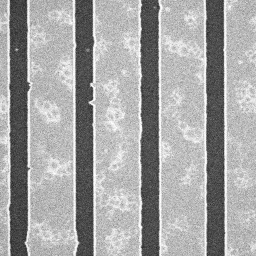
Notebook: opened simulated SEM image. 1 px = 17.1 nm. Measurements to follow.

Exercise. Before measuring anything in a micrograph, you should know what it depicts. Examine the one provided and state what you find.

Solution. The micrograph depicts one or a few lines or trenches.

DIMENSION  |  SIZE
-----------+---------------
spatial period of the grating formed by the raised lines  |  1120 nm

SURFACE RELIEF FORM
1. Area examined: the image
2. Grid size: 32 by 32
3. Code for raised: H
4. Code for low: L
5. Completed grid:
HLLLHHHHHLLLHHHHHHLLHHHHHHLLHHHH
HLLLHHHHHLLLHHHHHLLLHHHHHHLLHHHH
HLLLHHHHHLLLHHHHHLLLHHHHHHLLHHHH
HLLLHHHHHLLLHHHHHLLLHHHHHHLLHHHH
HLLLHHHHHLLLHHHHHLLLHHHHHHLLHHHH
HLLLHHHHHLLLHHHHHLLLHHHHHHLLHHHH
HLLLHHHHHLLLHHHHHLLLHHHHHHLLHHHH
HLLLHHHHHLLLHHHHHLLLHHHHHHLLHHHH
HLLLHHHHHLLLHHHHHLLLHHHHHHLLHHHH
HLLLHHHHHLLLHHHHHLLLHHHHHHLLHHHH
HLLLHHHHHLLLHHHHHLLLHHHHHHLLHHHH
HLLLHHHHHLLLHHHHHLLLHHHHHHLLHHHH
HLLLHHHHHLLLHHHHHLLLHHHHHHLLHHHH
HLLLHHHHHLLLHHHHHLLLHHHHHHLLHHHH
HLLLHHHHHLLLHHHHHLLLHHHHHHLLHHHH
HLLLHHHHHLLLHHHHHHLLHHHHHHLLHHHH
HLLLHHHHHLLLHHHHHHLLHHHHHHLLHHHH
HLLLHHHHHLLLHHHHHHLLHHHHHHLLHHHH
HLLLHHHHHLLLHHHHHLLLHHHHHHLLHHHH
HLLLHHHHHLLLHHHHHLLLHHHHHHLLHHHH
HLLLHHHHHLLLHHHHHLLLHHHHHHLLHHHH
HLLLHHHHHLLLHHHHHLLLHHHHHHLLHHHH
HLLLHHHHHLLLHHHHHHLLHHHHHHLLHHHH
HLLLHHHHHLLLHHHHHLLLHHHHHHLLHHHH
HLLLHHHHHLLLHHHHHHLLHHHHHHLLHHHH
HLLLHHHHHLLLHHHHHHLLHHHHHHLLHHHH
HLLLHHHHHLLLHHHHHHLLHHHHHHLLHHHH
HLLLHHHHHLLLHHHHHHLLHHHHHHLLHHHH
HLLLHHHHHLLLHHHHHHLLHHHHHHLLHHHH
HLLHHHHHHLLLHHHHHHLLHHHHHHLLHHHH
HLLHHHHHHHLLHHHHHHLLHHHHHHLLHHHH
HLLLHHHHHLLLHHHHHHLLHHHHHHLLHHHH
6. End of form